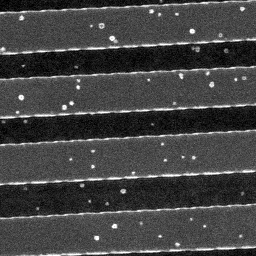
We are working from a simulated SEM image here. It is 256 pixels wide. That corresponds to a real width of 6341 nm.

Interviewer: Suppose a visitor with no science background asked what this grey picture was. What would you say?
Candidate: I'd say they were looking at lines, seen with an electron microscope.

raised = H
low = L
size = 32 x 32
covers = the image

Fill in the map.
LLLLLLLLLLLLLLLLLLLLLLLHHHHHHHHH
LLHHHHHHHHHHHHHHHHHHHHHHHHHHHHHH
HHHHHHHHHHHHHHHHHHHHHHHHHHHHHHHH
HHHHHHHHHHHHHHHHHHHHHHHHHHHHHHHH
HHHHHHHHHHHHHHHHHHHHHHHHHHHHHHHH
HHHHHHHHHHHHHHHHHHHHHHLLLLLLLLLL
HHHHLLLLLLLLLLLLLLLLLLLLLLLLLLLL
LLLLLLLLLLLLLLLLLLLLLLLLLLLLLLLL
LLLLLLLLLLLLLLLLLLLLLLLLLLLLHHHH
LLLLLLLLLHHHHHHHHHHHHHHHHHHHHHHH
HHHHHHHHHHHHHHHHHHHHHHHHHHHHHHHH
HHHHHHHHHHHHHHHHHHHHHHHHHHHHHHHH
HHHHHHHHHHHHHHHHHHHHHHHHHHHHHHHH
HHHHHHHHHHHHHHHHHHHHHHHHLLLLLLLL
HHHHLLLLLLLLLLLLLLLLLLLLLLLLLLLL
LLLLLLLLLLLLLLLLLLLLLLLLLLLLLLLL
LLLLLLLLLLLLLLLLLLLLLLLLLLLLHHHH
LLLLLLLLLLLHHHHHHHHHHHHHHHHHHHHH
HHHHHHHHHHHHHHHHHHHHHHHHHHHHHHHH
HHHHHHHHHHHHHHHHHHHHHHHHHHHHHHHH
HHHHHHHHHHHHHHHHHHHHHHHHHHHHHHHH
HHHHHHHHHHHHHHHHHHHHHHHHHHHHHLLL
HHHHHHHHHHHLLLLLLLLLLLLLLLLLLLLL
LLLLLLLLLLLLLLLLLLLLLLLLLLLLLLLL
LLLLLLLLLLLLLLLLLLLLLLLLLLLLLLLL
LLLLLLLLLLLLLLLLLLLLLLLLLLLLLLLL
LLLLLLLLLLLLLLHHHHHHHHHHHHHHHHHH
HHHHHHHHHHHHHHHHHHHHHHHHHHHHHHHH
HHHHHHHHHHHHHHHHHHHHHHHHHHHHHHHH
HHHHHHHHHHHHHHHHHHHHHHHHHHHHHHHH
HHHHHHHHHHHHHHHHHHHHHHHHHHHHHHHH
HHHHHHHHHHHHHHHHHLLLLLLLLLLLLLLL